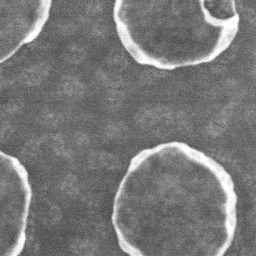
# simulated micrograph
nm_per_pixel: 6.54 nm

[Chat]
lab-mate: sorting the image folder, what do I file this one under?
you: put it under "raised bodies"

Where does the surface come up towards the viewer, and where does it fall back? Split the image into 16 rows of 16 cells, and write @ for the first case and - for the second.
@@@----@@@@@@---
@@@----@@@@@@@--
@@------@@@@@@--
@--------@@@@---
----------------
----------------
----------------
----------------
----------------
---------@@@----
@-------@@@@@---
@@------@@@@@@--
@@-----@@@@@@@--
@@-----@@@@@@@--
@------@@@@@@@--
@-------@@@@@@--